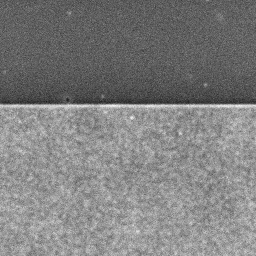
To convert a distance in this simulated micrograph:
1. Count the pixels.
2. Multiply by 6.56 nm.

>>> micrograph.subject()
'wiring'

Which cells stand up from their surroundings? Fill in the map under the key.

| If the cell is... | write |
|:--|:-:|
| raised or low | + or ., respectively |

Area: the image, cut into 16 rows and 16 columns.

................
................
................
................
................
................
................
++++++++++++++++
++++++++++++++++
++++++++++++++++
++++++++++++++++
++++++++++++++++
++++++++++++++++
++++++++++++++++
++++++++++++++++
++++++++++++++++